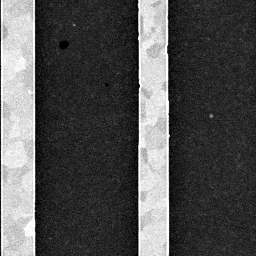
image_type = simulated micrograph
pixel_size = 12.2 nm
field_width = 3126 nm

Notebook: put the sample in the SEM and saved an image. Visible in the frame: one or a few lines or trenches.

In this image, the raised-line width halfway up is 0.373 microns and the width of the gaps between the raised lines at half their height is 1.28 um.